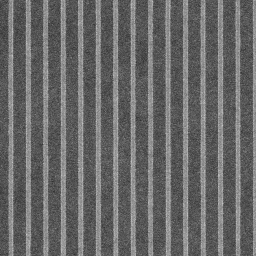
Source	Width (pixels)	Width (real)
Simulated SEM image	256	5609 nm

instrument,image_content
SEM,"parallel lines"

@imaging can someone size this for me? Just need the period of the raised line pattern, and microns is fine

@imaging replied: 0.383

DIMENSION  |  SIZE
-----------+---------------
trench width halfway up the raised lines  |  298 nm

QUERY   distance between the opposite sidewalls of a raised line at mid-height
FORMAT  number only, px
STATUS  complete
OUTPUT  3.75